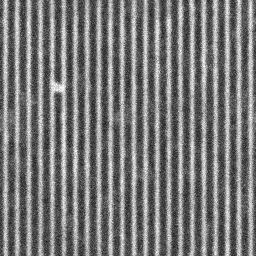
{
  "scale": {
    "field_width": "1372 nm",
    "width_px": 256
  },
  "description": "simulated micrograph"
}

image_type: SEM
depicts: parallel lines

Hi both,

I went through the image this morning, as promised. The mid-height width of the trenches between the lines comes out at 48.2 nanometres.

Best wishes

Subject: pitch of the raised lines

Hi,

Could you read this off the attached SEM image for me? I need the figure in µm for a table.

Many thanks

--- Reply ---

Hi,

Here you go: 0.0626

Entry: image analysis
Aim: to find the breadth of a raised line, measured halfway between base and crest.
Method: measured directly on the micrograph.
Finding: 13.4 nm